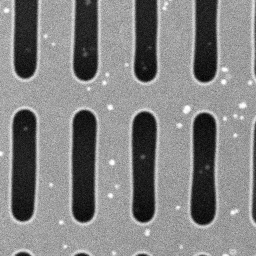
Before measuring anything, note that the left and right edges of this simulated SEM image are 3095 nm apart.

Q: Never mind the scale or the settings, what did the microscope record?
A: groups of lines, slits or small figures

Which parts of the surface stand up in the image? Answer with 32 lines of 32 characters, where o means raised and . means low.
oo...oooo...ooooo...oooo...ooooo
oo...oooo...ooooo...oooo...ooooo
oo...oooo...ooooo...oooo...ooooo
oo...oooo...ooooo...oooo...ooooo
oo...oooo...ooooo...oooo...ooooo
oo...oooo...ooooo...oooo...ooooo
oo...oooo...ooooo...oooo...ooooo
oo...oooo...ooooo...oooo...ooooo
oo...oooo...ooooo...oooo...ooooo
oo..ooooo...ooooo..ooooo...ooooo
oooooooooooooooooooooooooooooooo
oooooooooooooooooooooooooooooooo
oooooooooooooooooooooooooooooooo
oooooooooooooooooooooooooooooooo
oo..ooooo...ooooo..oooooo..ooooo
o....oooo...ooooo...oooo...ooooo
o....oooo...oooo....oooo...ooooo
o....oooo...oooo....oooo...ooooo
o....oooo...oooo....oooo...ooooo
o....oooo...oooo....oooo...oooo.
o....oooo...ooooo..ooooo...oooo.
o....oooo...ooooo..ooooo...oooo.
o....oooo...ooooo..ooooo...oooo.
o...ooooo...ooooo..ooooo...oooo.
o...ooooo...ooooo..ooooo...oooo.
o...ooooo...ooooo..ooooo...oooo.
o...ooooo...ooooo..ooooo...oooo.
oo..oooooo.oooooo..ooooo...ooooo
oooooooooooooooooooooooooooooooo
oooooooooooooooooooooooooooooooo
oooooooooooooooooooooooooooooooo
oo.ooooooooooooooooooooooooooooo